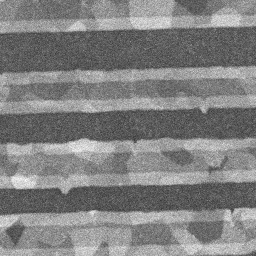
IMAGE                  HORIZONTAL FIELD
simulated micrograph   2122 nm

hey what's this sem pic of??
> one or a few lines or trenches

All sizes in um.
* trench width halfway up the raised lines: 0.351